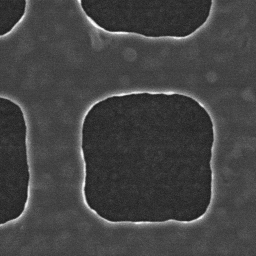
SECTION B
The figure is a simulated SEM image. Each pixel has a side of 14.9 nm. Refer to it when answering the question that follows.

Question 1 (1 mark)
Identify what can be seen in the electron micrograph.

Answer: holes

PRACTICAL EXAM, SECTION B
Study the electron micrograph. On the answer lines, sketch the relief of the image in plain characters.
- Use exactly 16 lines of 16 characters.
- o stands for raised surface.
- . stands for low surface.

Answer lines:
..ooo........ooo
.ooooo.......ooo
oooooooooooooooo
oooooooooooooooo
oooooooooooooooo
oooooooooooooooo
.ooooo......oooo
..ooo........ooo
..ooo........ooo
..ooo........ooo
..ooo........ooo
..ooo........ooo
..ooo........ooo
.ooooo.......ooo
oooooooooooooooo
oooooooooooooooo